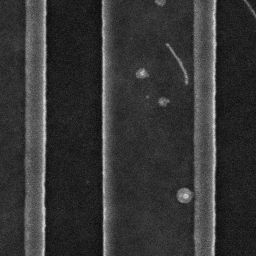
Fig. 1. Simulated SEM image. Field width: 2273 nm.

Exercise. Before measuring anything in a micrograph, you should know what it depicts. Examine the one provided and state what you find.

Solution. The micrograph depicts lines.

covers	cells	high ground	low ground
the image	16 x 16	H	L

HHHLLLHHHHHHHLLL
HHHLLLHHHHHHHLLL
HHHLLLHHHHHHHLLL
HHHLLLHHHHHHHLLL
HHHLLLLHHHHHHLLL
HHHLLLHHHHHHHLLL
HHHLLLHHHHHHHLLL
HHHLLLLHHHHHHLLL
HHHLLLLHHHHHHLLL
HHHLLLHHHHHHHLLL
HHHLLLLHHHHHHLLL
HHHLLLLHHHHHHLLL
HHHLLLLHHHHHHLLL
HHHLLLLHHHHHHLLL
HHHLLLLHHHHHHLLL
HHHLLLLHHHHHHLLL